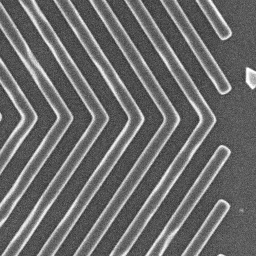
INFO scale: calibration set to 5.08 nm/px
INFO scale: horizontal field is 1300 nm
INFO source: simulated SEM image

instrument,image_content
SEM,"groups of lines, slits or small figures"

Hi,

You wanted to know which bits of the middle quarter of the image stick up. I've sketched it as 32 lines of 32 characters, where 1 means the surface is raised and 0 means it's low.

11100000111100000111100000111000
11110000011100000011100000111100
11110000001110000011110000011110
01111000001111000001111000001110
00111100000111000001111000001111
00111100000011100000111100000111
00011110000011110000011110000011
00001110000001110000011110000011
00001111000001111000001111000001
00000111100000111100000111000000
00000011100000111100000111100000
10000011110000011110000011110000
11000001111000001110000001110000
11000001111000001111000001111000
11000001111000001111000001111000
10000011110000001110000011110000
10000011110000011100000011110000
00000111100000111100000111100000
00001111000000111000001111000001
00001111000001110000001111000001
00011110000011110000011110000011
00111100000011100000111100000111
00111000000111000000111100000111
01111000001111000001111000001111
11110000001110000011110000011110
11100000011100000011110000011100
11100000111100000111100000111100
11000001111000001111000000111000
10000001110000001111000001110000
10000011110000011110000011110000
00000111100000111100000011100000
00000111000000111100000111000000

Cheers